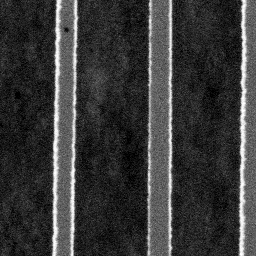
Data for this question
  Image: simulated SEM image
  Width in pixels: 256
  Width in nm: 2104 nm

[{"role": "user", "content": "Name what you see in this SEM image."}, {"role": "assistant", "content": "lines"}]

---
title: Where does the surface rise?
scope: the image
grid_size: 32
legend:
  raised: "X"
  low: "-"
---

-------XXX---------XX---------XX
-------XXX---------XX---------XX
-------XXX---------XX---------XX
-------XXX---------XX---------XX
-------XXX---------XX---------XX
-------XXX---------XX---------XX
-------XX----------XX---------XX
-------XXX---------XX---------XX
-------XX----------XX---------XX
-------XX----------XX---------XX
-------XX----------XX---------XX
-------XX----------XX---------XX
-------XX----------XX---------XX
-------XX----------XX---------XX
-------XX----------XX---------XX
-------XX----------XX---------XX
-------XX----------XX---------XX
-------XX----------XX---------XX
-------XX----------XX---------XX
-------XX----------XX---------XX
-------XX----------XX---------XX
-------XX----------XX---------XX
-------XX----------XX---------XX
-------XX----------XX---------XX
-------XX----------XX---------XX
-------XX----------XX---------XX
-------XX----------XX---------XX
-------XX----------XX---------XX
-------XX----------XX---------XX
-------XX----------XX---------XX
-------XX----------XX---------XX
-------XX----------XX---------XX